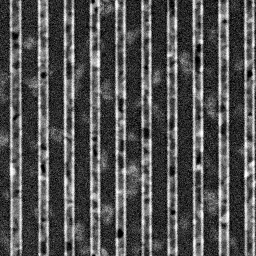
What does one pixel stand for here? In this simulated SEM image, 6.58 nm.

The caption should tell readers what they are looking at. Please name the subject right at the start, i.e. parallel lines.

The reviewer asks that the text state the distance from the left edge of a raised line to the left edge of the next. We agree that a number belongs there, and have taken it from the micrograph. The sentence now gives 171 nanometers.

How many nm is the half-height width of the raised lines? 56.8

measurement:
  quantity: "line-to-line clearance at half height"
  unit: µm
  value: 0.114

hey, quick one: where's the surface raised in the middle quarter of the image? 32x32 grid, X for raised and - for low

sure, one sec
XX-----XX----XX-----XX----XX----
XX-----XX----XX-----XX----XX----
XX-----XX----XX-----XX----XX----
XX-----XX----XX-----XX----XX----
XX-----XX----XX-----XX----XX----
XX-----XX----XX-----XX----XX----
XX-----XX----XX-----XX----XX----
XX-----XX----XX-----XX----XX----
XX-----XX----XX-----XX----XX----
XX-----XX----XX-----XX----XX----
XX-----XX----XX-----XX----XX----
XX-----XX----XX-----XX----XX----
XX-----XX----XX-----XX----XX----
XX-----XX----XX-----XX----XX----
XX-----XX----XX-----XX----XX----
XX-----XX----XX-----XX----XX----
XX-----XX----XX-----XX----XX----
XX-----XX----XX-----XX----XX----
XX-----XX----XX-----XX----XX----
XX-----XX----XX-----XX----XX----
XX-----XX----XX-----XX----XX----
XX-----XX----XX-----XX----XX----
XX-----XX----XX-----XX----XX----
XX-----XX----XX-----XX----XX----
XX-----XX----XX-----XX----XX----
XX-----XX----XX-----XX----XX----
XX-----XX----XX-----XX----XX----
XX-----XX----XX-----XX----XX----
XX-----XX----XX-----XX----XX----
XX-----XX----XX-----XX----XX----
XX-----XX----XX-----XX----XX----
XX-----XX----XX-----XX----XX----